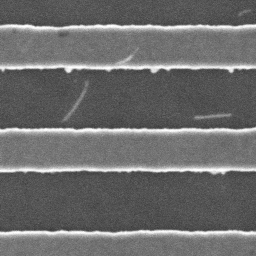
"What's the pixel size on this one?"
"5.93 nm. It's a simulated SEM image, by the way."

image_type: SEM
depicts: lines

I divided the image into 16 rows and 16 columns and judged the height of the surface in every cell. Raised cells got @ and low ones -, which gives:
----------------
----------------
@@@@@@@@@@@@@@@@
@@@@@@@@@@@@@@@@
----------------
----------------
----------------
----------------
@@@@@@@@@@@@@@@@
@@@@@@@@@@@@@@@@
@@@@@@@@@@@@@@@@
----------------
----------------
----------------
@@@@@@@-@@@@@@@@
@@@@@@@@@@@@@@@@